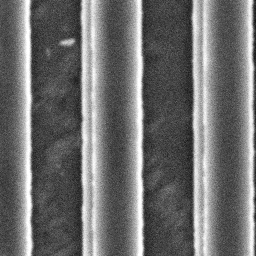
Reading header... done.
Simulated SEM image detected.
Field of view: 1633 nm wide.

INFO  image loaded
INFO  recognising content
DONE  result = lines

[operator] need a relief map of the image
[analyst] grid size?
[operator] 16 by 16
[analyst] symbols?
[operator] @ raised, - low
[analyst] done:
@@----@@@----@@@
@@----@@@---@@@@
@@----@@@----@@@
@@----@@@----@@@
@@----@@@----@@@
@@----@@@----@@@
@@----@@@----@@@
@@----@@@----@@@
@@----@@@----@@@
@@----@@@----@@@
@@----@@@----@@@
@@----@@@----@@@
@@----@@@----@@@
@@----@@@----@@@
@@----@@@----@@@
@@----@@@---@@@@